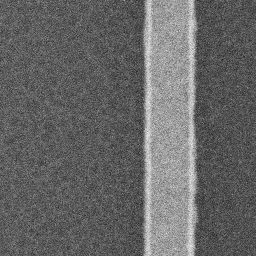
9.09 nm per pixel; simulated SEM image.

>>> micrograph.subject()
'one or a few lines or trenches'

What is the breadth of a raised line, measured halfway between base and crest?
379 nm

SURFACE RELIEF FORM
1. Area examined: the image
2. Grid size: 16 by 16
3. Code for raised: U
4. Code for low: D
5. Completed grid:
DDDDDDDDDUUUDDDD
DDDDDDDDDUUUDDDD
DDDDDDDDDUUUDDDD
DDDDDDDDDUUUDDDD
DDDDDDDDDUUUDDDD
DDDDDDDDDUUUDDDD
DDDDDDDDDUUUDDDD
DDDDDDDDDUUUDDDD
DDDDDDDDDUUUDDDD
DDDDDDDDDUUUDDDD
DDDDDDDDDUUUDDDD
DDDDDDDDDUUUDDDD
DDDDDDDDDUUUDDDD
DDDDDDDDDUUUDDDD
DDDDDDDDDUUUDDDD
DDDDDDDDDUUUDDDD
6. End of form